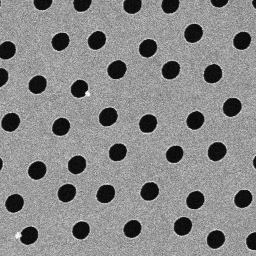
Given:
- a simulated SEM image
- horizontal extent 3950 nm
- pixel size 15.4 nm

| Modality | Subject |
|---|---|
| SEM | a regular array of holes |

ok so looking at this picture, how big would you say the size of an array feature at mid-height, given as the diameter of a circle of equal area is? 0.288 µm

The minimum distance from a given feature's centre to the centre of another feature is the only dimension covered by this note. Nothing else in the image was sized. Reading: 0.584 µm